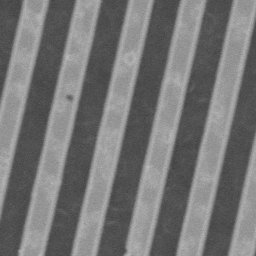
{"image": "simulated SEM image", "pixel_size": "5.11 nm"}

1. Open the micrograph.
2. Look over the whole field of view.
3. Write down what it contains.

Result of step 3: parallel lines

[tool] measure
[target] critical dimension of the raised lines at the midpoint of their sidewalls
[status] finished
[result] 110 nanometres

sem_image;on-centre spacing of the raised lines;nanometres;262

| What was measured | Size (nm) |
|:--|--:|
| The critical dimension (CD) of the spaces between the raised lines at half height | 153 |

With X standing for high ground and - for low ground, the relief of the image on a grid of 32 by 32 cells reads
---XXX----XX----XXX----XX----XXX
---XXX---XXX----XXX---XXX----XXX
---XX----XXX----XX----XXX----XXX
--XXX----XXX----XX----XXX----XX-
--XXX----XX----XXX----XXX---XXX-
--XXX---XXX----XXX----XX----XXX-
--XX----XXX----XXX---XXX----XXX-
-XXX----XXX----XX----XXX----XXX-
-XXX----XXX---XXX----XXX---XXX--
-XXX----XX----XXX----XX----XXX--
-XX----XXX----XXX----XX----XXX--
-XX----XXX----XX----XXX----XXX--
XXX----XXX---XXX----XXX----XX---
XXX----XX----XXX----XXX---XXX---
XXX---XXX----XXX----XX----XXX---
XX----XXX----XXX---XXX----XXX---
XX----XXX----XX----XXX----XX----
XX----XXX---XXX----XXX---XXX----
XX----XX----XXX----XX----XXX----
X----XXX----XXX---XXX----XXX----
X----XXX----XX----XXX----XXX---X
X----XXX---XXX----XXX---XXX----X
X----XXX---XXX----XXX---XXX----X
X---XXX----XXX----XX----XXX----X
----XXX----XXX---XXX----XXX---XX
----XXX----XX----XXX----XX----XX
----XXX---XXX----XXX---XXX----XX
---XXX----XXX----XX----XXX----XX
---XXX----XXX---XXX----XXX----XX
---XXX----XX----XXX----XXX---XXX
---XXX---XXX----XXX---XXX----XXX
---XX----XXX----XXX---XXX----XXX